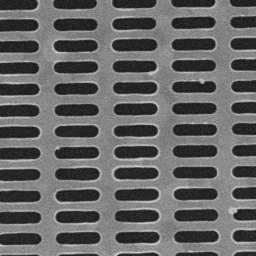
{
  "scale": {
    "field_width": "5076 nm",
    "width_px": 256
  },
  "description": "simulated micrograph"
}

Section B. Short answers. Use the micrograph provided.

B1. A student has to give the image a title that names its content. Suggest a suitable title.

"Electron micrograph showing groups of lines, slits or small figures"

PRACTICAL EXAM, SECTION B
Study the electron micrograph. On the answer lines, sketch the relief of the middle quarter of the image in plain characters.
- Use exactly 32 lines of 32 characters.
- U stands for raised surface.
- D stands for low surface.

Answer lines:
DDDDDDDDDUUUDDDDDDDDDDDUUUUDDDDD
DDDDDDDDUUUUDDDDDDDDDDDUUUUDDDDD
DDDDDDUUUUUUUUUUUUUUUUUUUUUUUUUU
UUUUUUUUUUUUUUUUUUUUUUUUUUUUUUUU
UUUUUDDUUUUUUUDDDDDDDDDUUUUUDDDD
DDDDDDDDUUUUDDDDDDDDDDDDUUUDDDDD
DDDDDDDDDUUUDDDDDDDDDDDUUUUDDDDD
DDDDDDDDUUUUUDDDDDDDDDDUUUUUUUUU
UUUUUUUUUUUUUUUUUUUUUUUUUUUUUUUU
UUUUUUUUUUUUUUUUUUUUUDUUUUUUUUUU
DDDDDDDDUUUUDDDDDDDDDDDUUUUDDDDD
DDDDDDDDDUUUDDDDDDDDDDDDUUUDDDDD
DDDDDDDDUUUUUDDDDDDDDDDUUUUUDDDD
UUUUUUUUUUUUUUUUUUUUUUUUUUUUUUUU
UUUUUUUUUUUUUUUUUUUUUUUUUUUUUUUU
DDDDDDDDUUUUUDDDDDDDDDDUUUUDDDDD
DDDDDDDDDUUUDDDDDDDDDDDDUUUDDDDD
DDDDDDDDDUUUDDDDDDDDDDDDUUUDDDDD
UUUDDDUUUUUUUUUUUUUUUUUUUUUUUUUU
UUUUUUUUUUUUUUUUUUUUUUUUUUUUUUUU
UUUDDDDDUUUUUDDDDDDDDDDUUUUUDDDD
DDDDDDDDDUUUDDDDDDDDDDDDUUUDDDDD
DDDDDDDDDUUUDDDDDDDDDDDDUUUDDDDD
DDDDDDDDUUUUUDDDDDDDDDDUUUUUUDDD
UUUUUUUUUUUUUUUUUUUUUUUUUUUUUUUU
UUUUUUUUUUUUUUUDDDUUUUUUUUUUUUDD
DDDDDDDDDUUUDDDDDDDDDDDDUUUDDDDD
DDDDDDDDDUUUDDDDDDDDDDDDUUUDDDDD
DDDDDDDDDUUUUDDDDDDDDDDUUUUUDDDD
UUUUUUUUUUUUUUUUUUUUUUUUUUUUUUUU
UUUUUUUUUUUUUUUUUUUUUUUUUUUUUUUU
DDDDDDDDDUUUUDDDDDDDDDDUUUUUDDDD